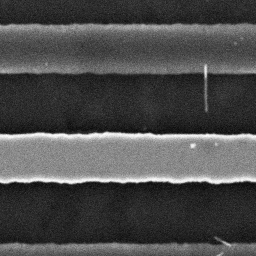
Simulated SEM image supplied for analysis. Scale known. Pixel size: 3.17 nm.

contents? lines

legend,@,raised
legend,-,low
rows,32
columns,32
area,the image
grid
--------------------------------
--------------------------------
--------------------------------
@@@@@@@@@@@@@@@@@@@@@@@@@@@@@@@@
@@@@@@@@@@@@@@@@@@@@@@@@@@@@@@@@
@@@@@@@@@@@@@@@@@@@@@@@@@@@@@@@@
@@@@@@@@@@@@@@@@@@@@@@@@@@@@@@@@
@@@@@@@@@@@@@@@@@@@@@@@@@@@@@@@@
@@@@@@@@@@@@@@@@@@@@@@@@@@@@@@@@
--------------------------------
--------------------------------
--------------------------------
--------------------------------
--------------------------------
--------------------------------
--------------------------------
--------------------------------
@@@@@@@@@@@@@@@@@@@@@@@@@@@@@@@@
@@@@@@@@@@@@@@@@@@@@@@@@@@@@@@@@
@@@@@@@@@@@@@@@@@@@@@@@@@@@@@@@@
@@@@@@@@@@@@@@@@@@@@@@@@@@@@@@@@
@@@@@@@@@@@@@@@@@@@@@@@@@@@@@@@@
@@@@@@@@@@@@@@@@@@@@@@@@@@@@@@@@
--------------------------------
--------------------------------
--------------------------------
--------------------------------
--------------------------------
--------------------------------
--------------------------------
--------------------------------
@@@@@@@@@@@@@@@@@@@@@@@@@@@@@@@@